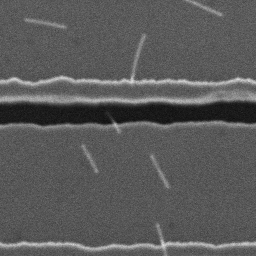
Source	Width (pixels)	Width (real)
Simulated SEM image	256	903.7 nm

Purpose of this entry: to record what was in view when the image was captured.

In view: lines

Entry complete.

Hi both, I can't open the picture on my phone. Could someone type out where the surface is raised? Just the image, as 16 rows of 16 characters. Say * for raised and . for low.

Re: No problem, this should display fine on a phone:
****************
****************
****************
****************
****************
****************
................
................
****************
****************
****************
****************
****************
****************
****************
****************